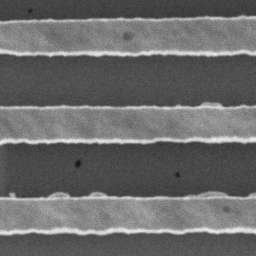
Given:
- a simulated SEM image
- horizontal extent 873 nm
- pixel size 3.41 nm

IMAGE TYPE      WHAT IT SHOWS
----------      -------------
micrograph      lines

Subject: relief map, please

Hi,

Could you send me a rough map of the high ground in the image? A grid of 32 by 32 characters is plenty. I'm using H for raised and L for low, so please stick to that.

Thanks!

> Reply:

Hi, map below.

LLLLLLLLLLLLLLLLLLLLLLLLLLLLLLLL
LLLLLLLLLLLLLLLLLLLLLLLLLLLLLLLL
LLLLLLHLLLLHHHHHHHHHHHHHHHHHHHHH
HHHHHHHHHHHHHHHHHHHHHHHHHHHHHHHH
HHHHHHHHHHHHHHHHHHHHHHHHHHHHHHHH
HHHHHHHHHHHHHHHHHHHHHHHHHHHHHHHH
HHHHHHHHHHHHHHHHHHHHHHHHHHHHHHHH
LLLLLLLLLLLLLLLLLLLLLLLLLLLLLLLL
LLLLLLLLLLLLLLLLLLLLLLLLLLLLLLLL
LLLLLLLLLLLLLLLLLLLLLLLLLLLLLLLL
LLLLLLLLLLLLLLLLLLLLLLLLLLLLLLLL
LLLLLLLLLLLLLLLLLLLLLLLLLLLLLLLL
LLLLLLLLLLLLLLLLLLLLLLLLLLLLLLLL
HHHHHHHHHHHHHHHHHHHHHHHHHHHHHHHH
HHHHHHHHHHHHHHHHHHHHHHHHHHHHHHHH
HHHHHHHHHHHHHHHHHHHHHHHHHHHHHHHH
HHHHHHHHHHHHHHHHHHHHHHHHHHHHHHHH
HHHHHHHHHHHHHHHHHHHHHHHHHHHHHHHH
LLLLLLLLLLLLLLLLLLLLLLLLLLLLLLLL
LLLLLLLLLLLLLLLLLLLLLLLLLLLLLLLL
LLLLLLLLLLLLLLLLLLLLLLLLLLLLLLLL
LLLLLLLLLLLLLLLLLLLLLLLLLLLLLLLL
LLLLLLLLLLLLLLLLLLLLLLLLLLLLLLLL
LLLLLLLLLLLLLLLLLLLLLLLLLLLLLLLL
LLLLLLLLLLLLLLLLLLLLLLLLLLLLLLLL
HHHHHHHHHHHHHHHHHHHHHHHHHHHHHHHH
HHHHHHHHHHHHHHHHHHHHHHHHHHHHHHHH
HHHHHHHHHHHHHHHHHHHHHHHHHHHHHHHH
HHHHHHHHHHHHHHHHHHHHHHHHHHHHHHHH
LLLLLLLLLLLLLLLLLLLLLLLLLLLLLLLL
LLLLLLLLLLLLLLLLLLLLLLLLLLLLLLLL
LLLLLLLLLLLLLLLLLLLLLLLLLLLLLLLL